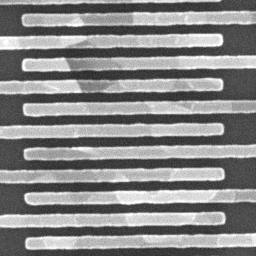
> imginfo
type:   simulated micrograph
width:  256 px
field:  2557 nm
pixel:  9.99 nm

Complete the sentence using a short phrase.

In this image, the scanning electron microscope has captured wiring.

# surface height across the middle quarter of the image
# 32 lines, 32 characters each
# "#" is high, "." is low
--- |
################################
##..............................
................................
................................
################################
################################
################################
................................
................................
................................
################################
################################
###########.....................
................................
................................
################################
################################
################################
................................
................................
................................
################################
################################
##########################......
................................
................................
..........######################
################################
################################
................................
................................
................................